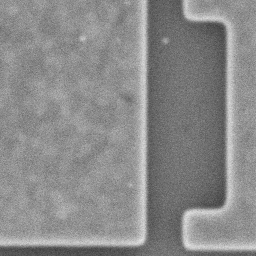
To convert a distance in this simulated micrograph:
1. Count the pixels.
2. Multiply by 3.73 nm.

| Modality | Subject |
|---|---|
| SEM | wiring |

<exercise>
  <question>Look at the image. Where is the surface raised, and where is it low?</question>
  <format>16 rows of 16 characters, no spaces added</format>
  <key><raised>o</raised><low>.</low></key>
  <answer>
ooooooooo..ooooo
ooooooooo.....oo
ooooooooo.....oo
ooooooooo.....oo
ooooooooo.....oo
ooooooooo.....oo
ooooooooo.....oo
ooooooooo.....oo
ooooooooo.....oo
ooooooooo.....oo
ooooooooo.....oo
ooooooooo.....oo
ooooooooo.....oo
ooooooooo...oooo
ooooooooo..ooooo
............oooo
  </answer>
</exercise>